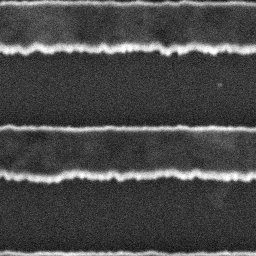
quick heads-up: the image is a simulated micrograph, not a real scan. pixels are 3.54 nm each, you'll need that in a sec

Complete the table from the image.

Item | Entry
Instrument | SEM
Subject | lines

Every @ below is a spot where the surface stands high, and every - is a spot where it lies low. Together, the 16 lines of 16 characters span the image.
@@@@@@@@@@@@@@@@
@@@@@@@@@@@@@@@@
@@@@@@@@@@@@@@@@
----------------
----------------
----------------
----------------
----------------
@@@@@@@@@@@@@@@@
@@@@@@@@@@@@@@@@
@@@@@@@@@@@@@@@@
----------------
----------------
----------------
----------------
----------------